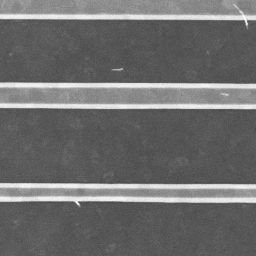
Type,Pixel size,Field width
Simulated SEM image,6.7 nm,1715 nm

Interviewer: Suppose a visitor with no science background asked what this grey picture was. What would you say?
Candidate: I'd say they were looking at one or a few lines or trenches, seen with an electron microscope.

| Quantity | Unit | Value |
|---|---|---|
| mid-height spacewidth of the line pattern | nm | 487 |